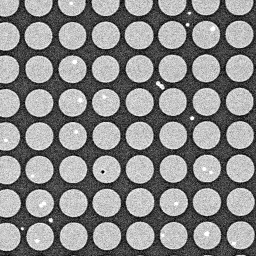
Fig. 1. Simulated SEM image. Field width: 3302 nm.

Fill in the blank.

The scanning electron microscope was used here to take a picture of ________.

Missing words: an array of small figures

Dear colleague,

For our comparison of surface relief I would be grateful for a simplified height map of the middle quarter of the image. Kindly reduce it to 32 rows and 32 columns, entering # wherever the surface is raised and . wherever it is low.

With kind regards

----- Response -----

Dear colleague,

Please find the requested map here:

#####..#######..######..#######.
#####..#######..######..#######.
#####..######...######..######..
#####...#####...#####....#####..
.##...............##...#........
........................#.......
.##......###.....###......###...
#####...#####...######...#####..
#####..#######..######..######..
#####..#######..######..######..
#####..#######..######..######..
#####...#####...######..######..
####.....###.....####.....###...
................................
................................
####....#####....####....#####..
#####...######..######..######..
######.#######..######..#######.
######.#######..######..#######.
#####...######..######..######..
#####...#####....####....####...
................................
................................
.###.....###.....####....####...
#####...#####...######...#####..
######.#######..######..#######.
######.#######..######..#######.
#####..#######..######..######..
#####...#####...######...#####..
.##......###......##.......#....
................................
..#.......##.....####.....###...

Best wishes